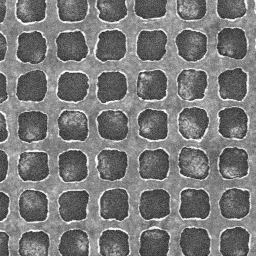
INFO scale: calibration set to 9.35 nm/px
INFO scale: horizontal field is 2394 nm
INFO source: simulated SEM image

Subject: a regular array of holes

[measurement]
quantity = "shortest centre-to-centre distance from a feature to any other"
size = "367 nm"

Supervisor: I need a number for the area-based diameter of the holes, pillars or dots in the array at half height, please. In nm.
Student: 304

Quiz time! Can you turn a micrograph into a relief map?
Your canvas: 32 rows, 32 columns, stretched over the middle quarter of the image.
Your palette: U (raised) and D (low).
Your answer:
UUUUUUUUUUUUUUUUUUUUUUUUUUUUUUUU
UUUUUUUUUUUUUUUUUUUUUUUDUUUUUUDD
DDDDDUUUUDDDDDDUUUUDDDDDDUUUUDDD
DDDDDDUUDDDDDDDDUUDDDDDDDDUUDDDD
DDDDDDUUUDDDDDDDUUDDDDDDDDUUDDDD
DDDDDDUUDDDDDDDDUUDDDDDDDDUUDDDD
DDDDDDUUDDDDDDDDUUDDDDDDDDUUDDDD
DDDDDDUUDDDDDDDDUUDDDDDDDDUUUDDD
DDDDDUUUDDDDDDDUUUUDDDDDDUUUUDDD
UDDUUUUUUDDDUUUUUUUUUUUUUUUUUUUU
UUUUUUUUUUUUUUUUUUUUUUUUUUUUUUUU
UUUUUUUUUUDDUUUUUUUUDDDDUUUUUUDD
DDDDDUUUUDDDDDDUUUUDDDDDDDUUUDDD
DDDDDDUUDDDDDDDDUUDDDDDDDDUUDDDD
DDDDDDUUDDDDDDDDUUDDDDDDDDUUDDDD
DDDDDDUUDDDDDDDDUUUDDDDDDDUUUDDD
DDDDDDUUDDDDDDDDUUUDDDDDDDUUUDDD
DDDDDDUUUDDDDDDDUUUDDDDDDDUUUDDD
DDDDDDUUUDDDDDDUUUUUDDDDDUUUUUDD
UUUUDUUUUUUUUUUUUUUUUUUUUUUUUUUU
UUUUUUUUUUUUUUUUUUUUUUUUUUUUUUUU
UDDDUUUUUUDDDDUUUUUUUDDDDUUUUDDD
DDDDDUUUUDDDDDDDUUUDDDDDDDUUUDDD
DDDDDDUUDDDDDDDDUUUDDDDDDDUUUDDD
DDDDDDUUDDDDDDDDUUUDDDDDDDUUUDDD
DDDDDDUUDDDDDDDDUUUDDDDDDDUUUDDD
DDDDDDUUDDDDDDDDUUUDDDDDDDUUUDDD
DDDDDDUUUDDDDDDUUUUDDDDDDDUUUDDD
DDDDDUUUUDDDDDDUUUUDDDDDDUUUUUUU
DDUDUUUUUUUUUUUUUUUUUUUUUUUUUUUU
UUUUUUUUUUUUUUUUUUUUUUUUUUUUUUUU
UDDDDUUUUUUDDDDUUUUUUUDDDUUUUUDD